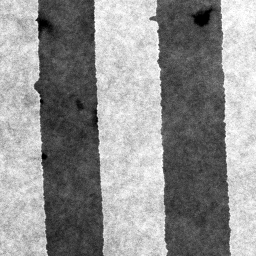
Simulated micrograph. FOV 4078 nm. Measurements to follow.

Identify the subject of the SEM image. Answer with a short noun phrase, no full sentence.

one or a few lines or trenches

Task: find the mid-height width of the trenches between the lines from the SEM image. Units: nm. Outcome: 1000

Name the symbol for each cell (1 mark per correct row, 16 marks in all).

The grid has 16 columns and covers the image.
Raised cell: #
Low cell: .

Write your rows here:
##....####....##
##....####....##
##....####....##
##....####....##
##....####....##
##....####....##
##....####....##
##....####....##
###...####....##
###...####....##
###...####....##
###...####....##
###...####....##
###...####....##
###...####....##
###...####....##